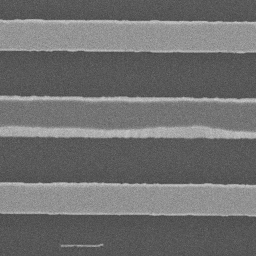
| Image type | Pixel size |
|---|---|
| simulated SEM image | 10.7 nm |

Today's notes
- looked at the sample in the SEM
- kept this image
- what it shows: lines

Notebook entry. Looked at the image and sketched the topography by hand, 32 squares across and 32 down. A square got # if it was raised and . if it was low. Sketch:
................................
................................
...###..........................
################################
################################
################################
..............................#.
................................
................................
................................
................................
................................
################################
################################
################################
################################
#.##############################
................................
................................
................................
................................
................................
................................
################################
################################
################################
################################
................................
................................
................................
................................
................................